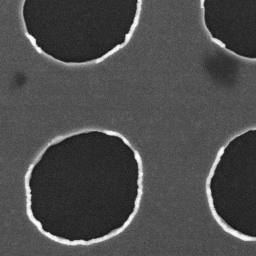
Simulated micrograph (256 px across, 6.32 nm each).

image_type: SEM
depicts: holes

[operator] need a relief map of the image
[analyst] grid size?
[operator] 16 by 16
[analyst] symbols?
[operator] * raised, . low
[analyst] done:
*........****...
**......*****...
**......******..
***...*********.
****************
****************
****************
****************
****...********.
***.....******..
**.......*****..
**.......****...
**......*****...
**......******..
***....********.
****************